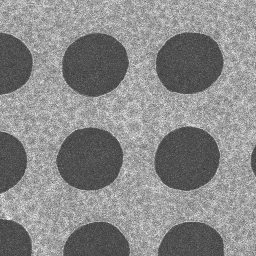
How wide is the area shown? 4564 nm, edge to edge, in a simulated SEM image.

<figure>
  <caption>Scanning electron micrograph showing holes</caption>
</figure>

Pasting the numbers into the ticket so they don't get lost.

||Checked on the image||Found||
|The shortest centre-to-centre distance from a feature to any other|1690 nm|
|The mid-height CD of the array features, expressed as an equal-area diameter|1160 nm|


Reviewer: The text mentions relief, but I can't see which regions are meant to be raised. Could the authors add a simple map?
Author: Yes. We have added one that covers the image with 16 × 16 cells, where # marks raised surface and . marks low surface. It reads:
################
################
.####..####..###
..##....##....##
..##....##....##
.###...###...###
################
################
.###...###...###
..##....##....##
..##....##....##
.###...###...###
################
################
..###...###...##
..##....##....##